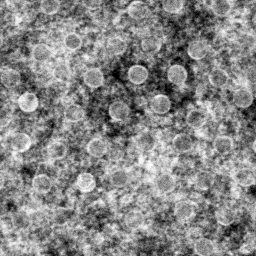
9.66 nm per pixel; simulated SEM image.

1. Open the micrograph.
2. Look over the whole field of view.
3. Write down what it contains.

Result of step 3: a regular array of raised bodies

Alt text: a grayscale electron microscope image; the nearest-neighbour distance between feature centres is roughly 34.1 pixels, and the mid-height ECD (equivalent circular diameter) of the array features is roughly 179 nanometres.